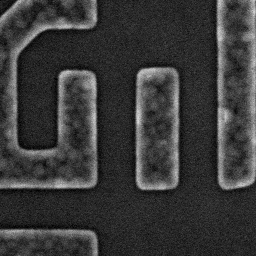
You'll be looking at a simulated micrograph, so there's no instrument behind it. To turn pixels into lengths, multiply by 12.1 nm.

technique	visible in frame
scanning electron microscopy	wiring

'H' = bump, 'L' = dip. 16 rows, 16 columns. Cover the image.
LHHHHHLLLLLLLLHH
HHHHHHLLLLLLLLHH
HHLLLLLLLLLLLLHH
HLLLLLLLLLLLLLHH
HLLLLLLLLHHLLLHH
HLLLHHLLLHHLLLHH
HLLLHHLLLHHLLLHH
HLLLHHLLLHHLLLHH
HLLLHHLLLHHLLLHH
HHLHHHLLLHHLLLHH
HHHHHHLLLHHLLLHH
HHHHHLLLLHHLLLHL
LLLLLLLLLLLLLLLL
LLLLLLLLLLLLLLLL
HHHHLLLLLLLLLLLL
HHHHHHLLLLLLLLLL